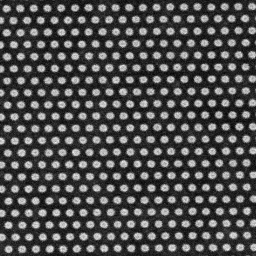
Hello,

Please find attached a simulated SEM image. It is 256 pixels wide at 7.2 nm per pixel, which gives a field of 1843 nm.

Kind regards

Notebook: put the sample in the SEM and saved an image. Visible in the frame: a regular array of raised bodies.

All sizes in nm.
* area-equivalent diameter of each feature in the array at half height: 50.1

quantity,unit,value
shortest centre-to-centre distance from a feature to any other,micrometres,0.0966